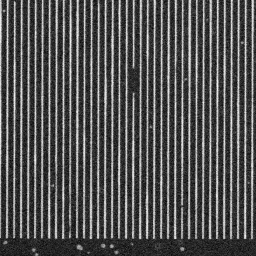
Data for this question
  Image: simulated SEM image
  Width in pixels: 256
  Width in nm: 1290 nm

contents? parallel lines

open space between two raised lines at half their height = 29 nm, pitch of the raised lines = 0.0353 um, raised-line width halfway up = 0.0057 microns